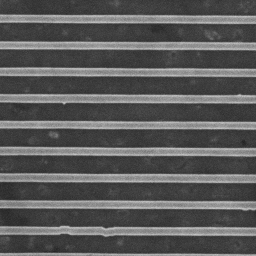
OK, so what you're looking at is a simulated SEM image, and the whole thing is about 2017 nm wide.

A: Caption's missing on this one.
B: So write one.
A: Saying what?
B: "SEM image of parallel lines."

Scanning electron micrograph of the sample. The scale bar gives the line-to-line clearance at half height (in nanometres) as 148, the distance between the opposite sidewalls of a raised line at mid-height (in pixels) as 7.99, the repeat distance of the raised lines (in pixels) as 26.4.